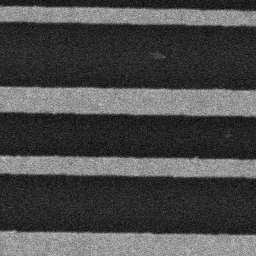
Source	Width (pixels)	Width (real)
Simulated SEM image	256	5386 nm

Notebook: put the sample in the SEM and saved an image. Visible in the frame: lines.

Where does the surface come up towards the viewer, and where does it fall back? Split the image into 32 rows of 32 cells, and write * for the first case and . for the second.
................................
********************************
********************************
................................
................................
................................
................................
................................
................................
................................
................................
********************************
********************************
********************************
................................
................................
................................
................................
................................
................................
********************************
********************************
................................
................................
................................
................................
................................
................................
................................
********************************
********************************
********************************